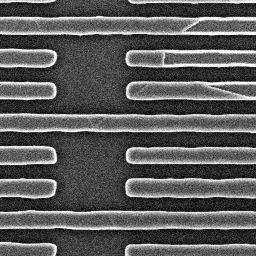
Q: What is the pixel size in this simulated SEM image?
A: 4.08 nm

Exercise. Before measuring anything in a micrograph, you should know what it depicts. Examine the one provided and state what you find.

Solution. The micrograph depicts wiring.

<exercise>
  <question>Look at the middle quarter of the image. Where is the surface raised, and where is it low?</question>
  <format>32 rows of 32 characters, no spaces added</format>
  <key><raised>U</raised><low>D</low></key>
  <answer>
DDDDDDDDDDDDDDDDDDDDUUUUUUUUUDDD
DDDDDDDDDDDDDDDDDDDDDDDDDDDDDDDD
DDDDDDDDDDDDDDDDDDDDDDDDDDDDDDDD
DDDDDDDDDDDDDDDDDDDDDDDDDDDDDDDD
DDDDDDDDDDDDDDDDDDDDDDDDDDDDDDDD
DDDDDDDDDDDDDDDDUUUUUUUUUUUUUUUU
DDDDDDDDDDDDDDDDUUUUUUUUUUUUUUUU
DDDDDDDDDDDDDDDDUUUUUUUUUUUUUUUU
DDDDDDDDDDDDDDDDUUUUUUUUUUUUUUUU
DDDDDDDDDDDDDDDDDDDDDDDDDDDDDDDD
DDDDDDDDDDDDDDDDDDDDDDDDDDDDDDDD
DDDDDDDDDDDDDDDDDDDDDDDDDDDDDDDD
DDDDDDDDDDDDDDDDDDDDDDDDDDDDDDDD
UUUUUUUUUUUUUUUUUUUUUUUUUUUUUUUU
UUUUUUUUUUUUUUUUUUUUUUUUUUUUUUUU
UUUUUUUUUUUUUUUUUUUUUUUUUUUUUUUU
UUUUUUUUUUUUUUUUUUUUUUUUUUUUUUUU
DDDDDDDDDDDDDDDDDDDDDDDDDDDDDDDD
DDDDDDDDDDDDDDDDDDDDDDDDDDDDDDDD
DDDDDDDDDDDDDDDDDDDDDDDDDDDDDDDD
DDDDDDDDDDDDDDDDDDDDDDDDDDDDDDDD
DDDDDDDDDDDDDDDDUUUUUUUUUUUUUUUU
DDDDDDDDDDDDDDDDUUUUUUUUUUUUUUUU
DDDDDDDDDDDDDDDDUUUUUUUUUUUUUUUU
DDDDDDDDDDDDDDDDUUUUUUUUUUUUUUUU
DDDDDDDDDDDDDDDDDDDDDDDDDDDDDDDD
DDDDDDDDDDDDDDDDDDDDDDDDDDDDDDDD
DDDDDDDDDDDDDDDDDDDDDDDDDDDDDDDD
DDDDDDDDDDDDDDDDDDDDDDDDDDDDDDDD
DDDDDDDDDDDDDDDDUUUUUUUUUUUUUUUU
DDDDDDDDDDDDDDDDUUUUUUUUUUUUUUUU
DDDDDDDDDDDDDDDDUUUUUUUUUUUUUUUU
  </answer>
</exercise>